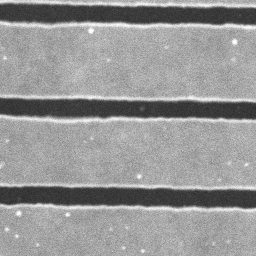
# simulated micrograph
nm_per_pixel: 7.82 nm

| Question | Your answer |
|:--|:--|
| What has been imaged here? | lines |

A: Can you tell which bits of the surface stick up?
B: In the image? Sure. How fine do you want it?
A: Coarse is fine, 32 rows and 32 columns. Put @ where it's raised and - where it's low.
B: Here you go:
---------@@@@@@@@@@@@@@@@@@@@@@@
--------------------------------
--------------------------------
@@@@@@@@@@@@@@@@@@@@@@@@@@@@@@@@
@@@@@@@@@@@@@@@@@@@@@@@@@@@@@@@@
@@@@@@@@@@@@@@@@@@@@@@@@@@@@@@@@
@@@@@@@@@@@@@@@@@@@@@@@@@@@@@@@@
@@@@@@@@@@@@@@@@@@@@@@@@@@@@@@@@
@@@@@@@@@@@@@@@@@@@@@@@@@@@@@@@@
@@@@@@@@@@@@@@@@@@@@@@@@@@@@@@@@
@@@@@@@@@@@@@@@@@@@@@@@@@@@@@@@@
@@@@@@@@@@@@@@@@@@@@@@@@@@@@@@@@
------------------@-@@--@@@@@@@@
--------------------------------
@@------------------------------
@@@@@@@@@@@@@@@@@@@@@@@@@@@@@@@@
@@@@@@@@@@@@@@@@@@@@@@@@@@@@@@@@
@@@@@@@@@@@@@@@@@@@@@@@@@@@@@@@@
@@@@@@@@@@@@@@@@@@@@@@@@@@@@@@@@
@@@@@@@@@@@@@@@@@@@@@@@@@@@@@@@@
@@@@@@@@@@@@@@@@@@@@@@@@@@@@@@@@
@@@@@@@@@@@@@@@@@@@@@@@@@@@@@@@@
@@@@@@@@@@@@@@@@@@@@@@@@@@@@@@@@
---------------------@@@@@@@@@@@
--------------------------------
--------------------------------
@@@@@@@@@@@@@@@@@@@@@@@@@@@@@@@@
@@@@@@@@@@@@@@@@@@@@@@@@@@@@@@@@
@@@@@@@@@@@@@@@@@@@@@@@@@@@@@@@@
@@@@@@@@@@@@@@@@@@@@@@@@@@@@@@@@
@@@@@@@@@@@@@@@@@@@@@@@@@@@@@@@@
@@@@@@@@@@@@@@@@@@@@@@@@@@@@@@@@